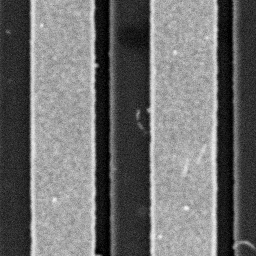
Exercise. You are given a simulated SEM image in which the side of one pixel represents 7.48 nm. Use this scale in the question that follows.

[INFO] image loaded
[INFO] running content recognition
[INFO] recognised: lines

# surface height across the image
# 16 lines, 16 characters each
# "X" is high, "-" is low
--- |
--XXXX---XXXXX--
--XXXX---XXXXX--
--XXXX---XXXXX--
--XXXX---XXXXX--
--XXXX---XXXXX--
--XXXX---XXXXX--
--XXXX---XXXXX--
--XXXX---XXXX---
--XXXX---XXXX---
--XXXX---XXXX---
--XXXX---XXXX---
--XXXX---XXXX---
--XXXX---XXXX---
--XXXX---XXXX---
--XXXX---XXXX---
--XXXX---XXXX---